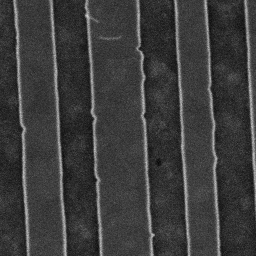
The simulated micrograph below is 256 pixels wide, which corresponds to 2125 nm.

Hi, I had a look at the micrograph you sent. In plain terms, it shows one or a few lines or trenches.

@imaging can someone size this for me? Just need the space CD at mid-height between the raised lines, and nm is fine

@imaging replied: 304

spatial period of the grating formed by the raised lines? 78.6 pixels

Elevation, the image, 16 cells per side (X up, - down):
-XX--XXXX--XX--X
-XX--XXXX--XX--X
-XX---XXX--XX--X
-XX---XXX--XX---
-XXX--XXX--XX---
-XXX--XXX--XX---
-XXX--XXX--XX---
-XXX--XXX--XX---
-XXX--XXX--XX---
-XXX--XXX--XX---
-XXX--XXX--XX---
-XXX--XXX---X---
--XX--XXX---XX--
--XX--XXX---XX--
--XX--XXX---XX--
--XX--XXXX--XX--